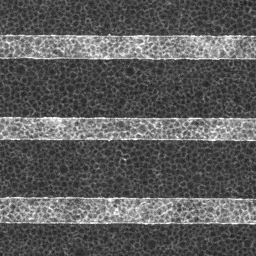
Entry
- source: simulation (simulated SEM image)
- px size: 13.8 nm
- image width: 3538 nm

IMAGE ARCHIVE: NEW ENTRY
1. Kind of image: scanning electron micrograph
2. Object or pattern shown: one or a few lines or trenches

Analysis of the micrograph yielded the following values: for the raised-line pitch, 1130 nanometers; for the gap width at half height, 59 pixels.